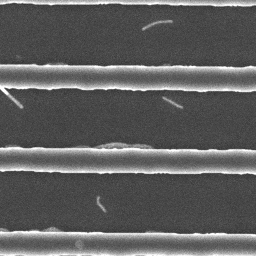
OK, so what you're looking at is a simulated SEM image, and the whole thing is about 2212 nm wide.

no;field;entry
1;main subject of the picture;lines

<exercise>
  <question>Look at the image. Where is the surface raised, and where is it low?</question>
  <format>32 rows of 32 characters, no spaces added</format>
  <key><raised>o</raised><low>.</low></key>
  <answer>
......o...........o..ooooooooooo
................................
................................
................................
................................
................................
................................
................................
ooooooooooooooooooooooooooooo.oo
oooooooooooooooooooooooooooooooo
oooooooooooooooooooooooooooooooo
................................
................................
................................
................................
................................
................................
................................
................................
oooooooooooooooooooooooooooooooo
oooooooooooooooooooooooooooooooo
......oooooooooooooooooooooooooo
................................
................................
................................
................................
................................
................................
................................
oooooooooooooooooooooooooooooooo
oooooooooooooooooooooooooooooooo
oooooooooooooooooooooooooooooooo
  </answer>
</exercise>